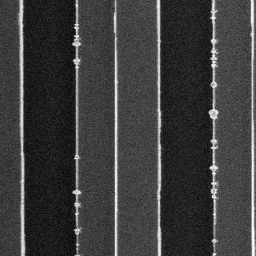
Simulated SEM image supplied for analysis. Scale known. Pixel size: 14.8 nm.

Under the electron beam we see lines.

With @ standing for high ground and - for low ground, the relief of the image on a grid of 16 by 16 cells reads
@----@@@@@---@@@
@----@@@@@---@@@
@----@@@@@---@@@
@----@@@@@---@@@
@----@@@@@---@@@
@----@@@@@---@@@
@----@@@@@---@@@
@----@@@@@---@@@
@----@@@@@---@@@
@----@@@@@---@@@
@----@@@@@---@@@
@----@@@@@---@@@
@----@@@@@---@@@
@----@@@@@---@@@
@----@@@@@---@@@
@----@@@@@---@@@